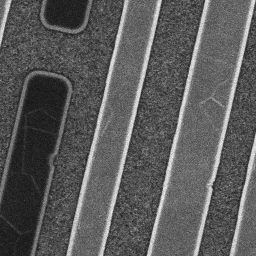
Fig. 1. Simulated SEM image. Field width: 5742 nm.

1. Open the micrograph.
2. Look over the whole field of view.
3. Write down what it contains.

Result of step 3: one or a few lines or trenches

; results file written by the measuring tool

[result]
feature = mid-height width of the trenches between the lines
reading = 831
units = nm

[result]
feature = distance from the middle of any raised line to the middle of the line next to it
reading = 1840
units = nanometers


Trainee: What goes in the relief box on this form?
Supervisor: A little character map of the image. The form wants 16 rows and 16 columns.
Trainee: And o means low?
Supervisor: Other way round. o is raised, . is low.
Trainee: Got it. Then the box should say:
...ooo..oo...ooo
...oo...oo...ooo
.......oo...ooo.
.......oo...ooo.
.......oo...ooo.
..oo...oo...ooo.
.ooo..ooo..ooo..
.ooo..oo...ooo..
.ooo..oo...ooo..
.oo...oo...ooo..
ooo..ooo...ooo..
ooo..oo...ooo..o
ooo..oo...ooo..o
ooo..oo...ooo..o
oo...oo...ooo..o
oo..oo...ooo...o